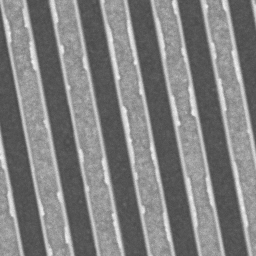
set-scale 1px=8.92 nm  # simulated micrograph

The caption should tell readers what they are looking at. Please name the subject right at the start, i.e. parallel lines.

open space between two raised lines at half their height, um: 0.231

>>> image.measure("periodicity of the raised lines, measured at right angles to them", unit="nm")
442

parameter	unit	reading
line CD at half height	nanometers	206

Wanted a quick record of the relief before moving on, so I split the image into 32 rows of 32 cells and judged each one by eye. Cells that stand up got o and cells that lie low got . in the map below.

ooo...ooo....ooo...ooo...ooo....
ooo....ooo...ooo...ooo....oo....
.ooo...ooo...ooo....oo....ooo...
.ooo...ooo...ooo....ooo...ooo...
.ooo...ooo....oo....ooo...ooo...
.ooo...ooo....ooo...ooo...ooo...
.ooo....ooo...ooo...ooo...ooo...
..oo....ooo...ooo...ooo....ooo..
..ooo...ooo...ooo....ooo...ooo..
..ooo...ooo...oooo...ooo...ooo..
..ooo...ooo....ooo...ooo...ooo..
..ooo....ooo...ooo...ooo...ooo..
..ooo....ooo...ooo...ooo....ooo.
...ooo...ooo...ooo....oo....ooo.
...ooo...ooo...ooo....ooo...ooo.
...ooo...ooo....ooo...ooo...ooo.
...ooo...ooo....ooo...ooo...ooo.
...ooo....ooo...ooo...ooo....oo.
....ooo...ooo...ooo....oo....ooo
....ooo...ooo...ooo....ooo...ooo
o...ooo...ooo....ooo...ooo...ooo
o...ooo...ooo....ooo...ooo...ooo
o...ooo....ooo...ooo...ooo....oo
o...ooo....ooo...ooo...ooo....oo
o....ooo...ooo...ooo....ooo...oo
oo...ooo...ooo...oooo...ooo...oo
oo...ooo...ooo....ooo...ooo...oo
oo...ooo....ooo...ooo...ooo...oo
oo...ooo....ooo...ooo...ooo....o
oo....ooo...ooo...ooo....ooo...o
ooo...ooo...ooo...ooo....ooo...o
ooo...ooo...ooo....ooo...ooo...o